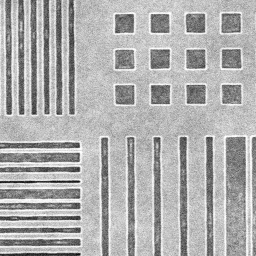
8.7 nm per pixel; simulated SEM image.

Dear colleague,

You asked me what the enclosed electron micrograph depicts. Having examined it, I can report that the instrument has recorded groups of lines, slits or small figures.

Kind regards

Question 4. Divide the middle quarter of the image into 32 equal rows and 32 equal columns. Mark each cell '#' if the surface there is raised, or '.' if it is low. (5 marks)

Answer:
#..##########.....####.....###..
#..#############################
#..#############################
#..#############################
#..#############################
#..##########.....####....#####.
#..##########.....####.....####.
#..##########.....####.....####.
#..##########.....####.....####.
#..##########.....####.....####.
#..#############################
#..#############################
#..#############################
################################
################################
################################
################################
################################
#########..#####..#####.#####..#
....#####..#####..####..#####..#
....#####..#####..####..#####..#
#########..#####..####..#####..#
....#####..#####..####..#####..#
....#####..#####..####..#####..#
....#####..#####..####..#####..#
#...#####..#####..####..#####..#
....#####..#####..####..#####..#
#########..#####..####..#####..#
#########..#####..####..#####..#
....#####..#####..####..#####..#
#########..#####..####..#####..#
....#####..#####..####..#####..#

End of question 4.